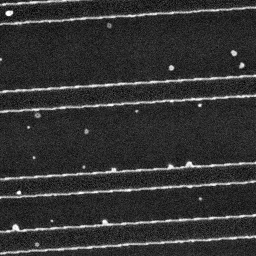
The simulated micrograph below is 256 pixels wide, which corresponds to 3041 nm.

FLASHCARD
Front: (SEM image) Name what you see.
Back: lines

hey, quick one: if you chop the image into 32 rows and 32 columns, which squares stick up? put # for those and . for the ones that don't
################################
########################........
########........................
................................
................................
................................
................................
................................
................................
...............................#
..............##################
################################
#######################.........
#########.......................
................................
................................
................................
................................
................................
................................
..............................##
.............###################
################################
####################............
#####...........................
................................
................................
......................##########
........########################
################################
################................
###.............................